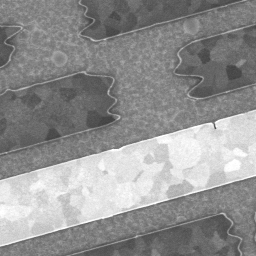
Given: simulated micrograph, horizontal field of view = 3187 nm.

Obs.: one or a few lines or trenches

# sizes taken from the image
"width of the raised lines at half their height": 785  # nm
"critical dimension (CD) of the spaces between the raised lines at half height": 0.33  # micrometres